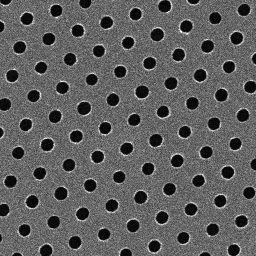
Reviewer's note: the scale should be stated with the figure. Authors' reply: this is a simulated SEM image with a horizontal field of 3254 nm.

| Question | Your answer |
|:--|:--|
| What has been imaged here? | a regular array of holes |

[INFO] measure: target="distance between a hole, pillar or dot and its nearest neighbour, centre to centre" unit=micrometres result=0.372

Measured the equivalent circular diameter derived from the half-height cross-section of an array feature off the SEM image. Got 0.16 micrometres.